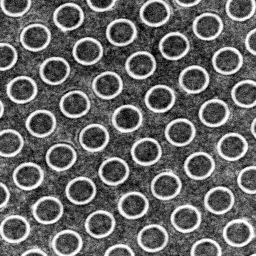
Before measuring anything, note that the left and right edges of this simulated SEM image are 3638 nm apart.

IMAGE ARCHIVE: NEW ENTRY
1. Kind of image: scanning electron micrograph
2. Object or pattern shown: a regular array of raised bodies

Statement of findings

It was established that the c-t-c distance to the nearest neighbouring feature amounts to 542 nm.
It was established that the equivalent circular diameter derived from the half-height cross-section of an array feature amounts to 26.2 pixels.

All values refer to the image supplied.